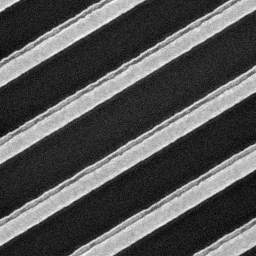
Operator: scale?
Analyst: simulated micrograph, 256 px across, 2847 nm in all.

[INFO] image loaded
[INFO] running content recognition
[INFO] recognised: lines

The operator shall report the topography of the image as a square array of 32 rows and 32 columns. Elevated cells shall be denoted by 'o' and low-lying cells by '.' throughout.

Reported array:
oo..........ooooo...........oooo
..........oooooo...........oooo.
.........ooooo...........ooooo..
.......ooooo...........ooooo....
.....oooooo...........oooo......
....ooooo...........ooooo.......
..ooooo...........ooooo.........
oooooo...........oooo...........
oooo...........ooooo............
oo...........ooooo............oo
o...........oooo............oooo
..........ooooo............ooooo
........ooooo............ooooo..
.......ooooo............ooooo...
.....ooooo............ooooo.....
...ooooo............ooooo.......
..ooooo............ooooo........
ooooo............ooooo..........
ooo............ooooo...........o
oo............ooooo..........ooo
............ooooo...........oooo
..........ooooo...........ooooo.
.........ooooo...........ooooo..
.......ooooo...........ooooo....
.....ooooo...........ooooo......
...oooooo..........oooooo.......
..ooooo...........ooooo.........
ooooo...........ooooo...........
oooo..........oooooo..........oo
oo...........ooooo..........oooo
...........ooooo...........ooooo
.........oooooo..........ooooo..